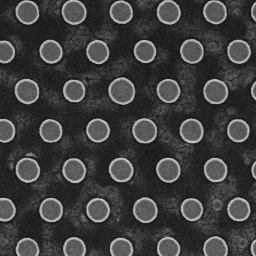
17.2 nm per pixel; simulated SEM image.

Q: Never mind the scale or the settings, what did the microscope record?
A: a regular array of raised bodies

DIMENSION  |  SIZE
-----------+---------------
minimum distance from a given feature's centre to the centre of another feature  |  783 nm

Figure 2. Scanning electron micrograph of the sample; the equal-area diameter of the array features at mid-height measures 387 nm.